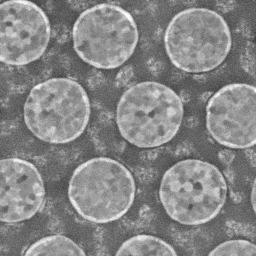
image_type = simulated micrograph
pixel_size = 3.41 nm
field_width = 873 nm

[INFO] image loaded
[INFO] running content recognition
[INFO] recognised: raised bodies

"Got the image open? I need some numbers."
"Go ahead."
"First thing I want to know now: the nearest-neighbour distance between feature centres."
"302 nm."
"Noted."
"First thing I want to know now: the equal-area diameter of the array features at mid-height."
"221 nanometers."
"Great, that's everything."